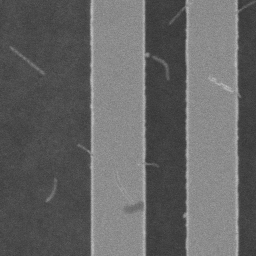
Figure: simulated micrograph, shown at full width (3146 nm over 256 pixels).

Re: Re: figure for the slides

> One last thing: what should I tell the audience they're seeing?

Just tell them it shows lines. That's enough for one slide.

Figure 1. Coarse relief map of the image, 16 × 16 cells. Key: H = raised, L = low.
LLLLLLHHHLLLHHHL
LLLLLLHHHLLLHHHL
LLLLLLHHHLLLHHHL
LLLLLLHHHLLLHHHL
LLLLLLHHHLLLHHHL
LLLLLLHHHLLLHHHL
LLLLLLHHHLLLHHHL
LLLLLLHHHLLLHHHL
LLLLLLHHHLLLHHHL
LLLLLLHHHLLLHHHL
LLLLLLHHHLLLHHHL
LLLLLLHHHLLLHHHL
LLLLLLHHHLLLHHHL
LLLLLLHHHLLLHHHL
LLLLLLHHHLLLHHHL
LLLLLLHHHLLLHHHL